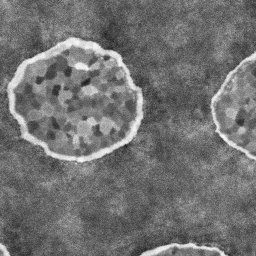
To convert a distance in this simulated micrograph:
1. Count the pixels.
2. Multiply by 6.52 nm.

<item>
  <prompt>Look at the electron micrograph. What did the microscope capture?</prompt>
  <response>raised bodies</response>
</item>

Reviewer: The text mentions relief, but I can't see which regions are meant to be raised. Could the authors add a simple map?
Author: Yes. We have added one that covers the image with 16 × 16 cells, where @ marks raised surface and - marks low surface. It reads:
----------------
----------------
----------------
---@@@@---------
-@@@@@@@-------@
-@@@@@@@------@@
-@@@@@@@@----@@@
-@@@@@@@@----@@@
--@@@@@@------@@
---@@@@--------@
----------------
----------------
----------------
----------------
----------------
----------@@@---